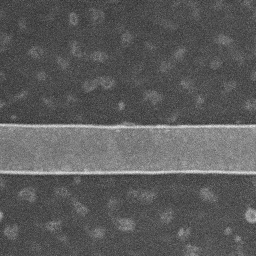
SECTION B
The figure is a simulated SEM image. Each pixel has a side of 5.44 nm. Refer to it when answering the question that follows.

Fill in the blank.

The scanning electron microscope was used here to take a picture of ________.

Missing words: one or a few lines or trenches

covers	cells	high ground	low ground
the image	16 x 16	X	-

----------------
----------------
----------------
----------------
----------------
----------------
----------------
----------------
XXXXXXXXXXXXXXXX
XXXXXXXXXXXXXXXX
XXXXXXXXXXXXXXXX
----------------
----------------
----------------
----------------
----------------